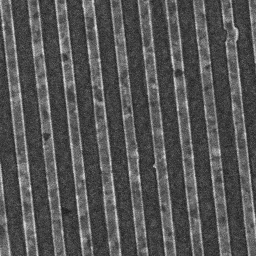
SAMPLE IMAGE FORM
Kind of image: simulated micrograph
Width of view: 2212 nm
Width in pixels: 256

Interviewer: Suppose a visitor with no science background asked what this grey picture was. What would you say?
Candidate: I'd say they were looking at parallel lines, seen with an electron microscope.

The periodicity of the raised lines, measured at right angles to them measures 237 nanometres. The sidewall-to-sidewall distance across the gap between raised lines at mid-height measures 155 nanometres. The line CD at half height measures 9.43 px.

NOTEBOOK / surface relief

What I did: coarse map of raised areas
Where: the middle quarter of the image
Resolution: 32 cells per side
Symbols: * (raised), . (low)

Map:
**.....**....***....***....***..
**.....**.....**....***.....**..
**.....**.....**.....**.....**..
**.....**.....**.....**.....**..
***....**.....**.....**.....**..
***....***....**.....**.....**..
***....***....***....**.....**..
***....***....***....**.....**..
.**....***....***....***....**..
.**.....**....***....***....***.
.**.....**.....**....***....***.
.**.....**.....**....***.....**.
.**.....**.....**.....**.....**.
.***....**.....**.....**.....**.
.***....***....**.....**.....**.
.***....***....**.....**.....**.
.***....***....***....**.....**.
..**....***....***....***....**.
..**.....**....***....***....***
..**.....**....***....***....***
..**.....**.....**....***.....**
..**.....**.....**.....**.....**
..***....**.....**.....**.....**
..***....**.....***....**.....**
..***....***....**.....**.....**
..***....***....***....**.....**
...**....***....***....***....**
...**.....**....***....***....**
...**.....**....***.....**....**
...**.....**.....**.....**.....*
...**.....**.....**.....**.....*
...**.....**.....**.....**.....*